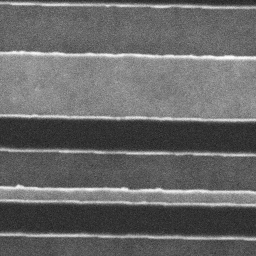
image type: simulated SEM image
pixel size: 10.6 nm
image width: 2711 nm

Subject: lines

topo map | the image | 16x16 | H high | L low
LLLLLLLLLLLLLLLL
LLLLLLLLLLLLLLLL
LLLLLLLLLLLLLLLL
HHHHHHHHHHLHLLLL
HHHHHHHHHHHHHHHH
HHHHHHHHHHHHHHHH
HHHHHHHHHHHHHHHH
HHHHHHHHHHHHHHHH
HHHHHHHHHHHHHHHH
LLLLLLHHHHHHHHHH
LLLLLLLLLLLLLLLL
LLLLLLLLLLLLLLLL
HHHHHHHHHHHHHHHH
HHHHHHHHHHHHHHHH
HHHHHHHHHHHHHHHH
LLLLLLLLLLLLLLLL